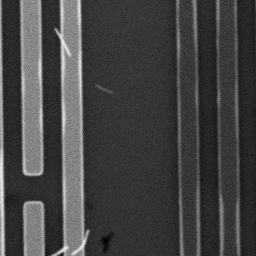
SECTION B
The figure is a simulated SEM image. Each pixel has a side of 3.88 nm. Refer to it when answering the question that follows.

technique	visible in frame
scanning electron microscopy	groups of lines, slits or small figures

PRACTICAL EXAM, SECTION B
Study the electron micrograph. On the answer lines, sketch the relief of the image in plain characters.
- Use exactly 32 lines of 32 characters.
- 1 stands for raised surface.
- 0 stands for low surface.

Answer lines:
00011000110000000000001100011000
00011000110000000000001100011000
00011000110000000000001100011000
00011000110000000000001100011100
00011001110000000000001100011100
00011000110000000000001110011100
00011000110000000000001110011100
00011000110000000000001110011100
00011000110000000000001110011100
00011000110000000000001110011100
00011000110000000000001110011100
00011000110000000000001110011100
00011000110000000000001110011100
00011000110000000000001110011100
00011000110000000000001110011100
00011000110000000000001110011100
00011000110000000000001110011100
00011000110000000000001110011100
00011000110000000000001110011100
00011000110000000000001110011100
00011000110000000000001110011100
00011000110000000000000110011100
00000000110000000000000110011100
00000000110000000000000110001100
00000000110000000000000110001100
00011000110000000000000110001100
00011000110000000000000110001100
00011000110000000000000110001100
00011000110000000000000110001100
00011000110000000000000110001100
00011000111000000000000110001100
00011100110000000000000110001100